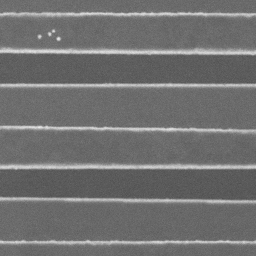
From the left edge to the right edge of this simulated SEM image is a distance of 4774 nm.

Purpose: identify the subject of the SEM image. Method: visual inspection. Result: lines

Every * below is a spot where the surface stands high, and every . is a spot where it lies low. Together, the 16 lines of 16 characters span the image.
****************
****************
****************
................
................
****************
****************
****************
****************
****************
................
................
*****...........
****************
****************
****************